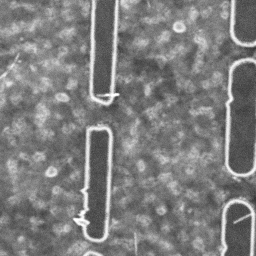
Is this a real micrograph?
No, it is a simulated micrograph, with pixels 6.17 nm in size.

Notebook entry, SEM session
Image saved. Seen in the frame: one or a few lines or trenches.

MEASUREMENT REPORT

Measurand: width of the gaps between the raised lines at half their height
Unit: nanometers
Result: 719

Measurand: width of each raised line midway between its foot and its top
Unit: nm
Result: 142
